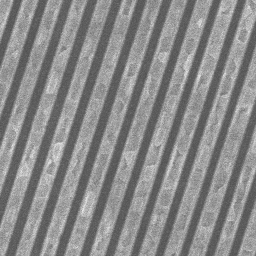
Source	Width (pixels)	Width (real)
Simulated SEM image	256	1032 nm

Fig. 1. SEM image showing parallel lines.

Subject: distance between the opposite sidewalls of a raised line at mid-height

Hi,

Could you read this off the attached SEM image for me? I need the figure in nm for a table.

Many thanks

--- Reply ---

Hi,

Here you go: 55.6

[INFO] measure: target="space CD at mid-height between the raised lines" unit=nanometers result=38.3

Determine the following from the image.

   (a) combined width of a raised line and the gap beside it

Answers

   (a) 95.3 nanometres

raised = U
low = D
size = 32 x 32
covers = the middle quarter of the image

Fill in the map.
DDDUUUDDDUUUUDDUUUUDDDUUUDDDUUUU
DDDUUUDDDUUUDDDUUUUDDDUUUDDDUUUD
DDDUUUDDDUUUDDDUUUDDDUUUUDDUUUUD
DDUUUDDDUUUUDDDUUUDDDUUUDDDUUUUD
DDUUUDDDUUUDDDUUUUDDDUUUDDDUUUDD
DDUUUDDDUUUDDDUUUDDDUUUUDDUUUUDD
DUUUDDDUUUUDDDUUUDDDUUUUDDUUUUDD
DUUUDDDUUUUDDUUUUDDDUUUDDDUUUDDD
DUUUDDDUUUDDDUUUUDDUUUUDDUUUUDDU
UUUUDDUUUUDDDUUUDDDUUUUDDUUUUDDU
UUUDDDUUUUDDUUUUDDUUUUDDDUUUDDDU
UUUDDDUUUDDDUUUUDDUUUUDDUUUUDDDU
UUUDDDUUUDDDUUUDDDUUUUDDUUUUDDUU
UUDDDUUUUDDUUUUDDDUUUDDDUUUDDDUU
UUDDDUUUDDDUUUUDDUUUUDDUUUUDDDUU
UUDDDUUUDDDUUUDDDUUUUDDUUUUDDUUU
UDDDUUUUDDUUUUDDDUUUDDDUUUDDDUUU
UDDDUUUDDDUUUUDDUUUUDDUUUUDDDUUU
UDDDUUUDDDUUUDDDUUUUDDUUUUDDUUUU
UDDUUUUDDUUUUDDDUUUDDDUUUDDDUUUU
DDDUUUDDDUUUUDDUUUUDDUUUUDDDUUUD
DDDUUUDDDUUUDDDUUUUDDUUUUDDUUUUD
DDUUUUDDUUUUDDDUUUDDDUUUDDDUUUUD
DDUUUDDDUUUUDDUUUUDDDUUUDDDUUUDD
DDUUUDDDUUUDDDUUUUDDUUUUDDUUUUDD
DUUUUDDUUUUDDDUUUDDDUUUDDDUUUUDD
DUUUDDDUUUUDDUUUUDDDUUUDDDUUUUDD
DUUUDDDUUUDDDUUUUDDUUUUDDUUUUDDD
UUUUDDUUUUDDDUUUDDDUUUUDDUUUUDDU
UUUDDDUUUUDDUUUUDDDUUUDDDUUUUDDU
UUUDDDUUUDDDUUUUDDUUUUDDUUUUDDDU
UUUDDUUUUDDDUUUDDDUUUUDDUUUUDDUU